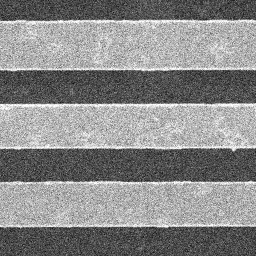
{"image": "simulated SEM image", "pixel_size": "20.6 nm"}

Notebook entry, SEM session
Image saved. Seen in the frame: one or a few lines or trenches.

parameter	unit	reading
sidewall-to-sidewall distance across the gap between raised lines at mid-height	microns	0.723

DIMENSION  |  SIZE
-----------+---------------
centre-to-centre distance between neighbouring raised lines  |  1640 nanometers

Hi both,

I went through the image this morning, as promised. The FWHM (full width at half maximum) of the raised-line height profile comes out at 902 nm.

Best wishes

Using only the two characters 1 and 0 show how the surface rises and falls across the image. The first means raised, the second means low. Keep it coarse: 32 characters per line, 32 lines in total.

00000000000000000000000000000000
00000000000000000000000000000000
00000000000000000000000000000000
11111111111111111111111111111111
11111111111111111111111111111111
11111111111111111111111111111111
11111111111111111111111111111111
11111111111111111111111111111111
11111111111111111111111111111111
00000000000000000000000000000000
00000000000000000000000000000000
00000000000000000000000000000000
00000000000000000000000000000000
11111111111111111111111111111111
11111111111111111111111111111111
11111111111111111111111111111111
11111111111111111111111111111111
11111111111111111111111111111111
00100000000000000000000000000000
00000000000000000000000000000000
00000000000000000000000000000000
00000000000000000000000000000000
00000000000000000000000000000000
11111111111111111111111111111111
11111111111111111111111111111111
11111111111111111111111111111111
11111111111111111111111111111111
11111111111111111111111111111111
00000000000000000000000000000000
00000000000000000000000000000000
00000000000000000000000000000000
00000000000000000000000000000000